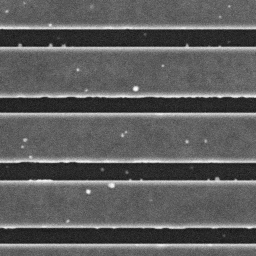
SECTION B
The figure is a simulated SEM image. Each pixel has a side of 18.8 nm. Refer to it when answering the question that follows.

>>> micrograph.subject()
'lines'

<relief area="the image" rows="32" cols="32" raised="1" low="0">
11111111111111111111111111111111
11111111111111111111111111111111
11111111111111111111111111111111
11111111111111111111111111111111
00000000000000000000000000000000
00000000000000000000000000000000
11111111111111111111111111111111
11111111111111111111111111111111
11111111111111111111111111111111
11111111111111111111111111111111
11111111111111111111111111111111
11111111111111111111111111111111
00000000000000000000000000000000
00000000000000000000000000000000
11111111111111111111111111111111
11111111111111111111111111111111
11111111111111111111111111111111
11111111111111111111111111111111
11111111111111111111111111111111
11111111111111111111111111111111
00000000000000000000000000000000
00000000000000000000000000000000
00000000000000000000000000000000
11111111111111111111111111111111
11111111111111111111111111111111
11111111111111111111111111111111
11111111111111111111111111111111
11111111111111111111111111111111
11000000000010100001111100100001
00000000000000000000000000000000
00000000000000000000000000000000
11111111111111111111111111111111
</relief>